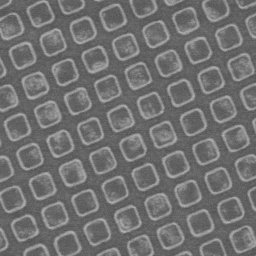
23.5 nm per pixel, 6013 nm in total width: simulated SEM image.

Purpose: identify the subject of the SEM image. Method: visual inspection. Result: a regular array of raised bodies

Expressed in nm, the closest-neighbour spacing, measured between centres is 747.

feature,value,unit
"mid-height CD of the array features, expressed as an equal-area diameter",564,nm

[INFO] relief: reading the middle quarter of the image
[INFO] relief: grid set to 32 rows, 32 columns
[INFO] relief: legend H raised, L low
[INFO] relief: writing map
HHHLLLHHHHHLLLLLLHHHLLLHHHHHHLLL
HHHLLLHHHLLLLLLLHHHHHLLLHHHHHLLL
HHHLLLLLLLLLLLLHHHHHHLLLHHHLLLLL
HHHLLLLLLLHHHLLLHHHHHHLLLLLLLLLL
HHLLLLLLHHHHHLLLHHHHHLLLLLLLLHHL
LLLLLLLLHHHHHHLLLHHLLLLLLLLHHHHL
LLLHHLLLHHHHHHLLLLLLLLLLLLHHHHHH
LHHHHHLLLHHHHHLLLLLLLLHLLLHHHHHH
HHHHHHLLLHHHLLLLLLLHHHHHLLLHHHHH
LHHHHHLLLLLLLLLLLLLHHHHHLLLHHHLL
LHHHHHLLLLLLLLHLLLLHHHHHLLLLLLLL
LHHHHHLLLLLLHHHHLLLHHHHHHLLLLLLL
LLLLLLLLLLLHHHHHHLLLHHHHLLLLLLHH
LLLLLLLLLLLHHHHHHLLLLHLLLLLLLHHH
LLLLLHHHHLLLHHHHHLLLLLLLLLLLLHHH
LLLLHHHHHLLLHHHHLLLLLLLHHHHLLLHH
LLLLHHHHHHLLLHHLLLLLLLHHHHHLLLHH
HLLLHHHHHHLLLLLLLLLLLLHHHHHLLLLH
HLLLHHHHHLLLLLLLHHHLLLHHHHHHLLLL
HHLLLHHLLLLLLLHHHHHHLLLHHHHLLLLL
HHLLLLLLLLLLLLHHHHHHLLLHHLLLLLLL
HHLLLLLLLHHLLLLHHHHHLLLLLLLLLLLL
LLLLLLLHHHHHLLLHHHHHLLLLLLLHHHLL
LLLLLLLHHHHHLLLHHHLLLLLLLHHHHHLL
LLHHLLLHHHHHHLLLLLLLLLLLLHHHHHHL
HHHHLLLHHHHHHLLLLLLLHHLLLHHHHHHL
HHHHHLLLHHHLLLLLLLHHHHHLLLHHHHHL
HHHHHLLLLLLLLLLLLHHHHHHLLLHHHLLL
HHHHHLLLLLLLLHLLLLHHHHHLLLLLLLLL
HHHHLLLLLLHHHHHLLLHHHHHLLLLLLLLH
LLLLLLLLLLHHHHHLLLHHHHLLLLLLLHHH
LLLLLLLLLLHHHHHHLLLLLLLLLLLLHHHH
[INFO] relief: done